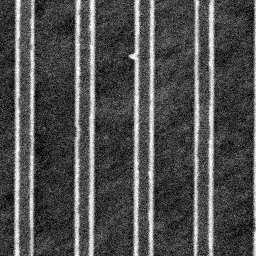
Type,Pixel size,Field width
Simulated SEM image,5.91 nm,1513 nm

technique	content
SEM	parallel lines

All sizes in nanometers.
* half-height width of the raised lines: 91.5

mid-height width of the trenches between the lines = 43.7 px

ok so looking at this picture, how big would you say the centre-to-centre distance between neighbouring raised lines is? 353 nanometers